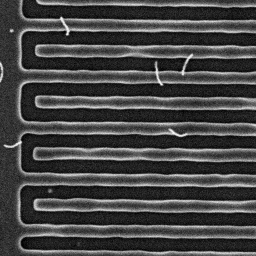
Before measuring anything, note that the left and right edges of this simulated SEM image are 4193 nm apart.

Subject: groups of lines, slits or small figures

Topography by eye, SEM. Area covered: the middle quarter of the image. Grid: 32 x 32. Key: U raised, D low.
DDDDDDDDDDDDDDDDDDDDDDDDDDDDDDDD
DDDDDDDDDDDDDDDDDDDDDDDDDDDDDDDD
UUUUUUUUUUUUUUUUUUUUUUUUUUUUUUUU
UUUUUUUUUUUUUUUUUUUUUUUUUUUUUUUU
UUUUUUUUUUUUUUUUUUUUUUUUUUUUUUUU
DDDDDDDDDDDDDDDDDDDDDDDDDDDDDDDD
DDDDDDDDDDDDDDDDDDDDDDDDDDDDDDDD
DDDDDDDDDDDDDDDDDDDDDDDDDDDDDDDD
UUUUUUUDDDDUUUUUUUUUUUUUDDDUUUUU
UUUUUUUUUUUUUUUUUUUUUUUUUUUUUUUU
UUUUUUUUUUUUUUUUUUUUUUUUUUUUUUUU
DDDDDDDDDDDDDDDDDDDDDDDDDDDDDDDD
DDDDDDDDDDDDDDDDDDDDDDDDDDDDDDDD
DDDDDDDDDDDDDDDDDDDDDDDDDDDDDDDD
DDDDDDDDDDDDDDDDDDDDDDDDDDDDDDDD
UUUUUUUUUUUUUUUUUUUUUUUUUUUUUUUU
UUUUUUUUUUUUUUUUUUUUUUUUUUUUUUUU
DDDDDDDDDDDDDDDDDDDUUUUUDDDUUUUU
DDDDDDDDDDDDDDDDDDDDDDDDDDDDDDDD
DDDDDDDDDDDDDDDDDDDDDDDDDDDDDDDD
DDDDDDDDDDDDDDDDDDDDDDDDDDDDDDDD
UUUUUUUUUUUUUUUUUUUUUUUUUUUUUUUU
UUUUUUUUUUUUUUUUUUUUUUUUUUUUUUUU
DDDDDDDUUUUUUUUUUUDUUUUUUUUUUUUU
DDDDDDDDDDDDDDDDDDDDDDDDDDDDDDDD
DDDDDDDDDDDDDDDDDDDDDDDDDDDDDDDD
DDDDDDDDDDDDDDDDDDDDDDDDDDDDDDDD
DDDDDDDDDDDDDDDDDDDDDDDDDDDDDDDD
UUUUUUUUUUUUUUUUUUUUUUUUUUUUUUUU
UUUUUUUUUUUUUUUUUUUUUUUUUUUUUUUU
DDDDDDDDDDDDDDDDDDDDDDDDDDDDDDDD
DDDDDDDDDDDDDDDDDDDDDDDDDDDDDDDD